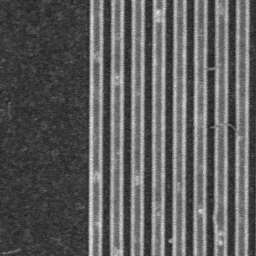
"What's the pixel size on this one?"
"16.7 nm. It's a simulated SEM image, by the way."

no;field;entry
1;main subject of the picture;parallel lines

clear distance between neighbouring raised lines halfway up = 10.8 px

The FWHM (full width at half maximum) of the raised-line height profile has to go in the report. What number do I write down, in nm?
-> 165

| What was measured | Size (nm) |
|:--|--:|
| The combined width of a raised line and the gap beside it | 348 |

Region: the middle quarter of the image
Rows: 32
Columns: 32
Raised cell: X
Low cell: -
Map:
-------XX---XX---XXX--XXX---XX--
-------XX---XX---XXX--XXX---XX--
-------XX---XX---XXX--XXX---XX--
-------XX---XX---XXX--XXX---XX--
-------XX---XX---XXX--XXX---XX--
-------XX---XX---XXX--XXX---XX--
-------XX---XX---XXX--XXX---XX--
-------XX---XXX--XX---XXX---XX--
-------XX---XXX--XX---XXX---XX--
-------XX---XX---XX---XXX---XX--
-------XX---XX---XX---XXX---XX--
-------XX---XX---XX---XXX---XX--
-------XX---XX---XX---XXX---XX--
-------XX---XX---XX---XXX---XX--
-------XX---XX---XX---XXX---XX--
-------XX---XX---XX---XXX---XX--
-------XX---XX---XX---XXX---XX--
-------XX---XX---XX---XXX---XX--
-------XX---XX---XX---XXX---XX--
-------XX---XX---XX---XXX---XX--
-------XX---XX---XX---XXX---XX--
-------XX---XX---XX---XXX---XX--
-------XX---XX---XX---XXX---XX--
-------XX---XX---XX---XXX---XX--
-------XX---XX---XX---XXX---XX--
-------XX---XX---XX---XXX---XX--
-------XX---XX---XX---XXX---XX--
-------XX---XX---XX---XXX---XX--
-------XX---XX---XX---XXX---XX--
-------XX---XX---XX---XXX---XX--
-------XX---XX---XX---XXX--XXX--
-------XX---XX---XX---XXX---XX--